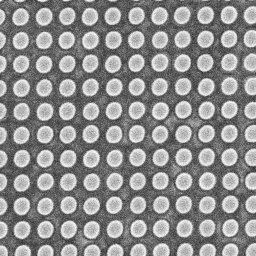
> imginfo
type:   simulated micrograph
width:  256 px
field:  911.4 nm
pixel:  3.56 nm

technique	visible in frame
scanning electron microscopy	a regular array of raised bodies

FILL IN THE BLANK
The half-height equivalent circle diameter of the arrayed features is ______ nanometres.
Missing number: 56.4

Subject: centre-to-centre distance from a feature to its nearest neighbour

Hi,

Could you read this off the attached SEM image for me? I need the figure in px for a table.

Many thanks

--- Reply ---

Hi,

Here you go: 22.9